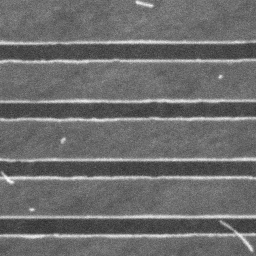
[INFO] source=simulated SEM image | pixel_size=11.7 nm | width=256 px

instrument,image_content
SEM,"lines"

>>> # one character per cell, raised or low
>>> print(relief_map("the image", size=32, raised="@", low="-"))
@@@@@@@@@@@@@@@@@@@@@@@@@@@@@@@@
@@@@@@@@@@@@@@@@@@@@@@@@@@@@@@@@
@@@@@@@@@@@@@@@@@@@@@@@@@@@@@@@@
@@@@@@@@@@@@@@@@@@@@@@@@@@@@@@@@
@@@@@@@@@@@@@@@@@@@@@@@@@@@@@@@@
--------------------------------
--------------------------------
--------------@---------------@@
@@@@@@@@@@@@@@@@@@@@@@@@@@@@@@@@
@@@@@@@@@@@@@@@@@@@@@@@@@@@@@@@@
@@@@@@@@@@@@@@@@@@@@@@@@@@@@@@@@
@@@@@@@@@@@@@@@@@@@@@@@@@@@@@@@@
@@@@@@@@@@@@@@@@@@@@@@@@@@@@@@@@
--------------------------------
--------------------------------
@@@@@@@@@@@@@@@@@@@@@@@@@@@@@@@@
@@@@@@@@@@@@@@@@@@@@@@@@@@@@@@@@
@@@@@@@@@@@@@@@@@@@@@@@@@@@@@@@@
@@@@@@@@@@@@@@@@@@@@@@@@@@@@@@@@
@@@@@@@@@@@@@@@@@@@@@@@@@@@@@@@@
--------------------------------
--------------------------------
@@@@@@@@@@@@@@@@@@@@@@@@@@@@@@@@
@@@@@@@@@@@@@@@@@@@@@@@@@@@@@@@@
@@@@@@@@@@@@@@@@@@@@@@@@@@@@@@@@
@@@@@@@@@@@@@@@@@@@@@@@@@@@@@@@@
@@@@@@@@@@@@@@@@@@@@@@@@@@@@@@@@
--------------------------------
--------------------------------
@--@@@@@---@@@--@@@@@@@@@@@@@@@@
@@@@@@@@@@@@@@@@@@@@@@@@@@@@@@@@
@@@@@@@@@@@@@@@@@@@@@@@@@@@@@@@@